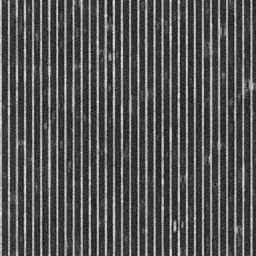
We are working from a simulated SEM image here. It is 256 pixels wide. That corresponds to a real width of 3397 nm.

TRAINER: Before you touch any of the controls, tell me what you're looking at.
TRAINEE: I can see parallel lines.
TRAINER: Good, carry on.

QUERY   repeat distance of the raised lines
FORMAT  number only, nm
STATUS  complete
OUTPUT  107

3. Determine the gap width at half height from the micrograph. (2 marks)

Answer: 87.9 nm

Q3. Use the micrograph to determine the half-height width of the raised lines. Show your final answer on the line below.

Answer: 0.0183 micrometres